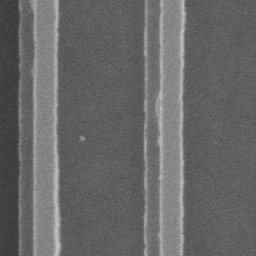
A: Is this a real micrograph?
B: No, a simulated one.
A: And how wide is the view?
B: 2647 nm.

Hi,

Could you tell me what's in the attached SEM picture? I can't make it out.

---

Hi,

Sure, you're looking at lines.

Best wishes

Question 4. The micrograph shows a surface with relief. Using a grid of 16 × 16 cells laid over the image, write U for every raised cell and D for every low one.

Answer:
DUUDDDDDDUUDDDDD
DUUDDDDDDUUDDDDD
DUUDDDDDDUUDDDDD
DUUDDDDDDUUDDDDD
DUUDDDDDDUUDDDDD
DUUDDDDDDUUDDDDD
DUUDDDDDDUUDDDDD
DUUDDDDDDUUDDDDD
DUUDDDDDDUUDDDDD
DUUDDDDDDUUDDDDD
DUUDDDDDDUUDDDDD
DUUDDDDDDUUDDDDD
DUUDDDDDDUUDDDDD
DUUDDDDDDUUDDDDD
DUUDDDDDDUUDDDDD
DUUDDDDDDUUDDDDD